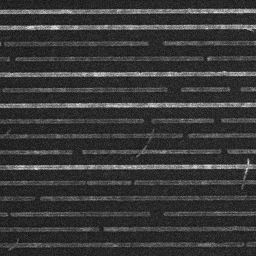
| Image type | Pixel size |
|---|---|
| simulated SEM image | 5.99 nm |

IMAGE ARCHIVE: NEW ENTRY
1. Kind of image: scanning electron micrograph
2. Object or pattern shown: parallel lines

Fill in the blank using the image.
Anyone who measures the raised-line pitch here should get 93.2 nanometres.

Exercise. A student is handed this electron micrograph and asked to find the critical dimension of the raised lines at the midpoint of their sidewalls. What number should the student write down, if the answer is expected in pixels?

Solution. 3.51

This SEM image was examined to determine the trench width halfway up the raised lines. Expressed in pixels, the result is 12.1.